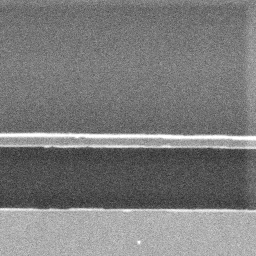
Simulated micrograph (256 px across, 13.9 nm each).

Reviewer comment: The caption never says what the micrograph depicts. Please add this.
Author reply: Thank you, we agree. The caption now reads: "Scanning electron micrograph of lines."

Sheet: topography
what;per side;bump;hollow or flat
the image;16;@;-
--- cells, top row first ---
----------------
----------------
----------------
----------------
----------------
----------------
----------------
----------------
----------------
----------------
----------------
----------------
----------------
@@@@@@@@@@@@@@@@
@@@@@@@@@@@@@@@@
@@@@@@@@@@@@@@@@